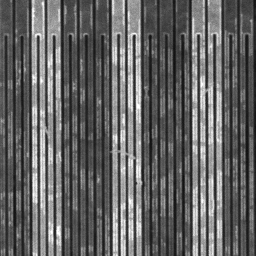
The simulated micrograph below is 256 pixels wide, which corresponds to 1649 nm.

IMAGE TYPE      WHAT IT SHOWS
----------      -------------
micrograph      parallel lines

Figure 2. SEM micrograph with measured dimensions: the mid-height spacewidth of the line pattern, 19.3 nm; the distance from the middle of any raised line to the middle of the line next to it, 51.6 nm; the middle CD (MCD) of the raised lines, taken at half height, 31.4 nanometers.